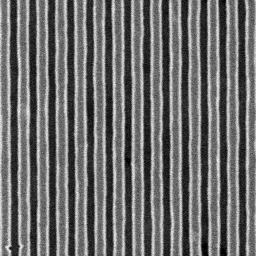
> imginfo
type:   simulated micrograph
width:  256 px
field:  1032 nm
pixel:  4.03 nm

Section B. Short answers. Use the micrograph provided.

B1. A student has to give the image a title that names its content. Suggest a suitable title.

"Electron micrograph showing parallel lines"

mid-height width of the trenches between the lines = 0.0378 um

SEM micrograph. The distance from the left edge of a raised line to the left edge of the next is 19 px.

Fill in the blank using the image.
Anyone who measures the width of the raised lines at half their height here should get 37.8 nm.